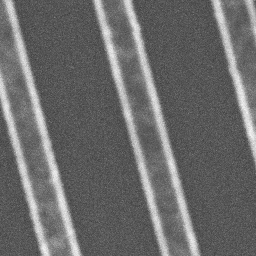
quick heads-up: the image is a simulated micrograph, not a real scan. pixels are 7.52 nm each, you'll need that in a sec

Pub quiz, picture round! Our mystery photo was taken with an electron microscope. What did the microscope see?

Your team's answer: one or a few lines or trenches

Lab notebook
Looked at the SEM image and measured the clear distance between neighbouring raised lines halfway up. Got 0.644 micrometres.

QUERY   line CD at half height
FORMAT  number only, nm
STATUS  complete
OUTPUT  222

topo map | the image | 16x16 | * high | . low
*.....**......**
*.....**......**
*......**.....**
*......**.....**
**.....**......*
**......*......*
**......**.....*
.**.....**.....*
.**.....**......
.**......**.....
.**......**.....
..**.....**.....
..**.....**.....
..**......**....
..**......**....
...**.....**....